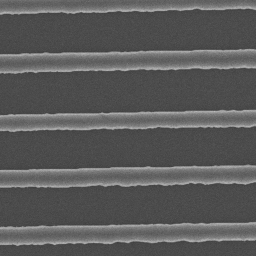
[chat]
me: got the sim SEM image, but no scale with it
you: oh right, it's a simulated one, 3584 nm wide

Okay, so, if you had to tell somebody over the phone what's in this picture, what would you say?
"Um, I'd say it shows lines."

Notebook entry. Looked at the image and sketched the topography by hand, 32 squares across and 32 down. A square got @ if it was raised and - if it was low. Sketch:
@@@@@@@@@@@@@@@@@@@@@@@@@@@@@@@@
@@@@@@@@@@@@@@------------------
--------------------------------
--------------------------------
--------------------------------
--------------------------------
-----------------@@@@@@@@@@@@@@@
@@@@@@@@@@@@@@@@@@@@@@@@@@@@@@@@
@@@@@@@@@@@@@@@@@@@@@@@@-@@@@---
--------------------------------
--------------------------------
--------------------------------
--------------------------------
--------------------------------
@@@@@@@@@@@@@@@@@@@@@@@@@@@@@@@@
@@@@@@@@@@@@@@@@@@@@@@@@@@@@@@@@
--------------------------------
--------------------------------
--------------------------------
--------------------------------
--------------------------------
@@@@@@@@@@@@@@@@@@@@@@@@@@@@@@@@
@@@@@@@@@@@@@@@@@@@@@@@@@@@@@@@@
--------------------------------
--------------------------------
--------------------------------
--------------------------------
--------------------------------
@@@@@@@@@@@@@@@@@@@@@@@@@@@@@@@@
@@@@@@@@@@@@@@@@@@@@@@@@@@@@@@@@
@@@@@@--------------------------
--------------------------------